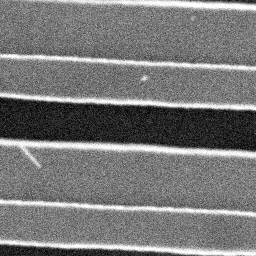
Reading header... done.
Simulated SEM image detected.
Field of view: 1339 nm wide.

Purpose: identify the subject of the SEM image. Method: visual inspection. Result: lines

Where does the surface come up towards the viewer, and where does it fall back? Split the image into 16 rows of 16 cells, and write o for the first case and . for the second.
oooooooooooooooo
oooooooooooooooo
oooooooooooooooo
oooooooooooooooo
oooooooooooooooo
oooooooooooooooo
.........ooooooo
................
................
oooooooooooo....
oooooooooooooooo
oooooooooooooooo
oooooooooooooooo
oooooooooooooooo
oooooooooooooooo
.......ooooooooo